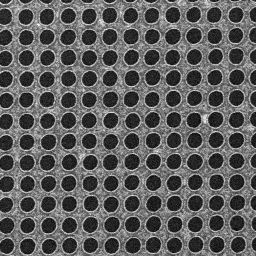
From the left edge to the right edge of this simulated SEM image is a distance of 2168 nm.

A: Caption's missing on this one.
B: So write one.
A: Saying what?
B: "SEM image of a regular array of holes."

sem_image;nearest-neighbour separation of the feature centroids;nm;173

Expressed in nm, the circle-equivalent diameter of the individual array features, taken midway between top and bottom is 135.